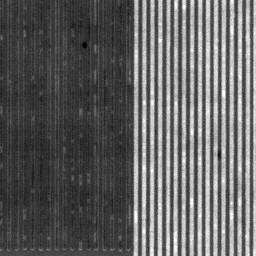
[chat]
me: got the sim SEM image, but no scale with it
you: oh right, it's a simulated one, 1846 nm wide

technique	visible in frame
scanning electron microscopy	parallel lines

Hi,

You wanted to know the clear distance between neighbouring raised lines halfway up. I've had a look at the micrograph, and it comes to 34.3 nanometers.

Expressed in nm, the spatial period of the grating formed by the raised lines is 57.3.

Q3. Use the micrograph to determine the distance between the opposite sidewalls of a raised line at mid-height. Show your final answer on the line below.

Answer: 0.0243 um